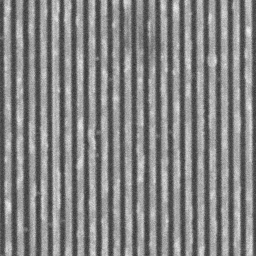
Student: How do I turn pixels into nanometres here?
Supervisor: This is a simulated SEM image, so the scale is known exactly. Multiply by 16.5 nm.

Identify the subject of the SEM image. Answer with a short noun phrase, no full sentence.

parallel lines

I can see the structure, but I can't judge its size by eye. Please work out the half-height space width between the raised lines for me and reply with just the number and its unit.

105 nanometres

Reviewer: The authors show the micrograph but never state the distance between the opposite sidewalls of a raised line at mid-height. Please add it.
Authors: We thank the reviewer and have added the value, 0.0847 micrometres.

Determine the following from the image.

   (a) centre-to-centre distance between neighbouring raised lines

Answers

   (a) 199 nm